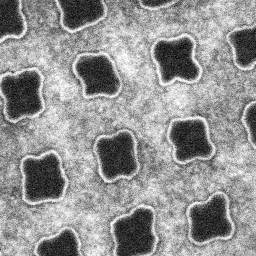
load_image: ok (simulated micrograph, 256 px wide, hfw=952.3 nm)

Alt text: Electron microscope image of raised bodies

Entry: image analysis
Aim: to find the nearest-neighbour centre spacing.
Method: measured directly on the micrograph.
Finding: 292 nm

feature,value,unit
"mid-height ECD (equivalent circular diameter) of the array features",177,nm